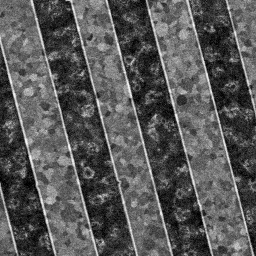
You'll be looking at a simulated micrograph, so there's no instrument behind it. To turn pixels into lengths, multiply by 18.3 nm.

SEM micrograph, one or a few lines or trenches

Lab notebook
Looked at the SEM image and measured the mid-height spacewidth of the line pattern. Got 708 nm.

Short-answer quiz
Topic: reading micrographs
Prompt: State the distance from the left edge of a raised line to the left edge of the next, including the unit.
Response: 75.7 pixels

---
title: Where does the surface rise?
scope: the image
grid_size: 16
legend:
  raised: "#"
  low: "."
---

##...##..###..##
##...##...##...#
###..##...##...#
###..###..###..#
.##...##..###..#
.##...##...##...
.###..##...##...
.###..###..###..
..##...##..###..
..##...##...##..
..###..##...##..
..###..###..###.
...##...##..###.
...##...##...##.
#..###..##...##.
#..###..###..###